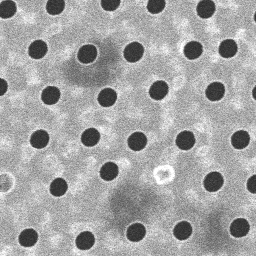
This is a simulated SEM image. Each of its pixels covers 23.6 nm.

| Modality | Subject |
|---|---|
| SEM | a regular array of holes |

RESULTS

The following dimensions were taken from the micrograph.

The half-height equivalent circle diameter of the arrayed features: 474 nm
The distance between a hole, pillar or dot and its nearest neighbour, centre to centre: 1080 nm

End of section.